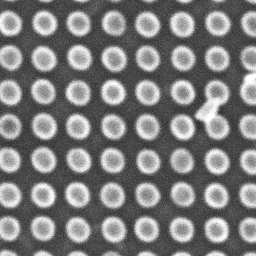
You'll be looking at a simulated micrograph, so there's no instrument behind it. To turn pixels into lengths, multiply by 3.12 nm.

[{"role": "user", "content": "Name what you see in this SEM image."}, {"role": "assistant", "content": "a regular array of raised bodies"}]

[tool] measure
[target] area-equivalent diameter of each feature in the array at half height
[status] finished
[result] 0.071 micrometres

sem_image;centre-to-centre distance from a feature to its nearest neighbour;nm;105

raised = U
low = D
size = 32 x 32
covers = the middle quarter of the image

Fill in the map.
DDUUUUDDDDDUUUUDDDDUUUUDDDDDUUUU
DDDDDDDDDDDDUUDDDDDDDUDDDDDDDDDD
DDDDDDDDDDDDDDDDDDDDDDDDDDDDDDDD
DDDDDDDDDDDDDDDDDDDDDDDDDDDDDDDD
DDDDDDDDDDDUUDDDDDDDUDDDDDDDDUDD
DUUUUUDDDDUUUUDDDDDUUUUDDDDUUUUU
DUUUUUDDDDUUUUUDDDUUUUUUDDDUUUUU
DUUUUUDDDDUUUUUDDDUUUUUUDDDUUUUU
DUUUUUDDDDUUUUUDDDDUUUUUDDDUUUUU
DDUUUDDDDDDUUUDDDDDDUUUDDDDDDUUU
DDDDDDDDDDDDDDDDDDDDDDDDDDDDDDDD
DDDDDDDDDDDDDDDDDDDDDDDDDDDDDDDD
DDDDDDDDDDDDDDDDDDDDDDDDDDDDDDDD
DDUUUDDDDDUUUUDDDDDUUUDDDDDDUUUD
DUUUUUDDDDUUUUUDDDDUUUUDDDDUUUUU
DUUUUUDDDDUUUUUDDDUUUUUDDDDUUUUU
DUUUUUDDDDUUUUUDDDUUUUUDDDDUUUUU
DUUUUUDDDDUUUUUDDDDUUUUDDDDDUUUU
DDDUDDDDDDDDUDDDDDDDUUDDDDDDDUUD
DDDDDDDDDDDDDDDDDDDDDDDDDDDDDDDD
DDDDDDDDDDDDDDDDDDDDDDDDDDDDDDDD
DDUUUDDDDDDUUDDDDDDDDDDDDDDDDDDD
DUUUUUDDDDUUUUDDDDDUUUUDDDDUUUUD
DUUUUUDDDDUUUUUDDDUUUUUUDDDUUUUU
DUUUUUDDDDUUUUUDDDUUUUUUDDDUUUUU
DDUUUUDDDDUUUUUDDDDUUUUUDDDUUUUU
DDDUUDDDDDDUUUDDDDDUUUUDDDDDUUUD
DDDDDDDDDDDDDDDDDDDDDDDDDDDDDDDD
DDDDDDDDDDDDDDDDDDDDDDDDDDDDDDDD
DDDDDDDDDDDDDDDDDDDDDDDDDDDDDDDD
DUUUUDDDDDUUUDDDDDDUUUDDDDDDUUUD
DUUUUUDDDDUUUUUDDDUUUUUDDDDUUUUU